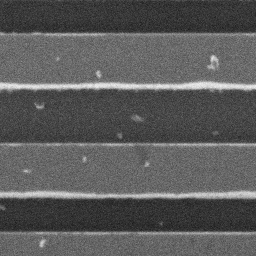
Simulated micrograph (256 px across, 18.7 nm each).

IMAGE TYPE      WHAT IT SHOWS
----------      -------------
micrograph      lines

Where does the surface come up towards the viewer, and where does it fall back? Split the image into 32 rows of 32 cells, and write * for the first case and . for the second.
................................
................................
................................
................................
********************************
********************************
********************************
********************************
********************************
********************************
********************************
................................
................................
................................
................................
................................
................................
................................
********************************
********************************
********************************
********************************
********************************
********************************
..........**************.**.....
................................
................................
................................
................................
********************************
********************************
********************************